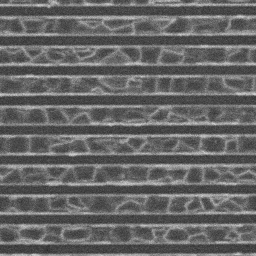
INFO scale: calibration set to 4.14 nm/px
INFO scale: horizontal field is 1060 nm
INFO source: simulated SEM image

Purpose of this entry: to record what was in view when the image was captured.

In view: parallel lines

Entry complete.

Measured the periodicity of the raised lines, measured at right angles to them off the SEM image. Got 123 nanometers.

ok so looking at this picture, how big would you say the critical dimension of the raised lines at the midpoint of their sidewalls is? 79.8 nm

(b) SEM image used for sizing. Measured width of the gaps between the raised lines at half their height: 42 nm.